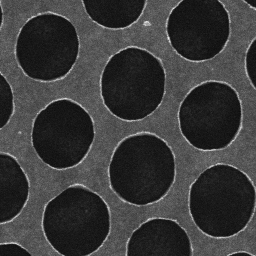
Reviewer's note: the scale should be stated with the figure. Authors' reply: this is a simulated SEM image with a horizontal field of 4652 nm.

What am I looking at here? holes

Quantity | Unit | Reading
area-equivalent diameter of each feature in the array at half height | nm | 1180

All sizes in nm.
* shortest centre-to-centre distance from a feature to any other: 1560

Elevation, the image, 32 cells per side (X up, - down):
XXXXXXXXXXX-------XXXX------XXX-
XXXXXXXXXXX-------XXX-------XXXX
XXXX----XXXX-----XXXX--------XXX
XXX------XXXXXXXXXXXX--------XXX
XX--------XXXXXXXXXXX--------XXX
XX--------XXXXXXXXXXX-------XXX-
XX--------XXXXX---XXXX-----XXXX-
XX-------XXXXX------XXXX--XXXXX-
XXX------XXXX-------XXXXXXXXXXX-
XXXX----XXXXX--------XXXXXXXXXX-
-XXXXXXXXXXXX--------XXXX---XXXX
-XXXXXXXXXXXX-------XXXX-----XXX
--XXXXXXXXXXX-------XXX-------XX
--XXXX----XXX-------XXX-------XX
-XXXX------XXXX---XXXX--------XX
-XXX--------XXXXXXXXXX--------XX
XXXX--------XXXXXXXXXXX-------XX
XXXX--------XXXX----XXX------XXX
XXXX-------XXXX------XXXX---XXXX
-XXXX------XXX--------XXXXXXXXXX
--XXXX----XXXX--------XXXXXXXXXX
---XXXXXXXXXXX--------XXX-----XX
---XXXXXXXXXXX--------XXX------X
----XXXXX--XXX-------XXX--------
---XXXX-----XXX-----XXXX--------
---XXX-------XXXX-XXXXXX--------
--XXXX--------XXXXXXXXXX--------
-XXXX---------XXXXX--XXX-------X
XXXXX---------XXX------XX-----XX
XXXXXX-------XXX-------XXXX--XXX
X-XXXX-------XXX--------XXXXXXXX
----XXX-----XXXX--------XXXXXXXX